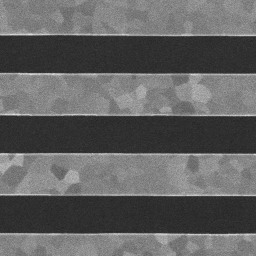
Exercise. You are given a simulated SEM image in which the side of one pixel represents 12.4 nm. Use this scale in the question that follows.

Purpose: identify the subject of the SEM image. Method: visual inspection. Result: wiring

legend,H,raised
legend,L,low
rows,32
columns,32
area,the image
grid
HHHHHHHHHHHHHHHHHHHHHHHHHHHHHHHH
HHHHHHHHHHHHHHHHHHHHHHHHHHHHHHHH
HHHHHHHHHHHHHHHHHHHHHHHHHHHHHHHH
HHHHHHHHHHHHHHHHHHHHHHHHHHHHHHHH
LLLLLLLLLLLLLLLLLLLLLLLLLLLLLLLL
LLLLLLLLLLLLLLLLLLLLLLLLLLLLLLLL
LLLLLLLLLLLLLLLLLLLLLLLLLLLLLLLL
LLLLLLLLLLLLLLLLLLLLLLLLLLLLLLLL
LLLLLLLLLLLLLLLLLLLLLLLLLLLLLLLL
HHHHHHHHHHHHHHHHHHHHHHHHHHHHHHHH
HHHHHHHHHHHHHHHHHHHHHHHHHHHHHHHH
HHHHHHHHHHHHHHHHHHHHHHHHHHHHHHHH
HHHHHHHHHHHHHHHHHHHHHHHHHHHHHHHH
HHHHHHHHHHHHHHHHHHHHHHHHHHHHHHHH
LLLLLLLLLLLLLLLLLLLLLLLLLLLLLLLL
LLLLLLLLLLLLLLLLLLLLLLLLLLLLLLLL
LLLLLLLLLLLLLLLLLLLLLLLLLLLLLLLL
LLLLLLLLLLLLLLLLLLLLLLLLLLLLLLLL
LLLLLLLLLLLLLLLLLLLLLLLLLLLLLLLL
HHHHHHHHHHHHHHHHHHHHHHHHHHHHHHHH
HHHHHHHHHHHHHHHHHHHHHHHHHHHHHHHH
HHHHHHHHHHHHHHHHHHHHHHHHHHHHHHHH
HHHHHHHHHHHHHHHHHHHHHHHHHHHHHHHH
HHHHHHHHHHHHHHHHHHHHHHHHHHHHHHHH
LLLLLLLLLLLLLLLLLLLLLLLLLLLLLLLL
LLLLLLLLLLLLLLLLLLLLLLLLLLLLLLLL
LLLLLLLLLLLLLLLLLLLLLLLLLLLLLLLL
LLLLLLLLLLLLLLLLLLLLLLLLLLLLLLLL
LLLLLLLLLLLLLLLLLLLLLLLLLLLLLLLL
HHHHHHHHHHHHHHHHHHHHHHHHHHHHHHHH
HHHHHHHHHHHHHHHHHHHHHHHHHHHHHHHH
HHHHHHHHHHHHHHHHHHHHHHHHHHHHHHHH